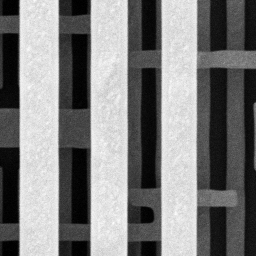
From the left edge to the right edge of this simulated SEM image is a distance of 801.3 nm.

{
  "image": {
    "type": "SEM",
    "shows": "wiring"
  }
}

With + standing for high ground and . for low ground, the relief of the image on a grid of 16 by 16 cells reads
.+++..++..++....
.+++..++..++....
.+++..++..++....
.+++..++..++....
.+++..++..++....
.+++..++..++....
.+++..++..++....
.+++..++..++....
.+++..++..++....
.+++..++..++....
.+++..++..++....
.+++..++..++....
.+++..++..++....
.+++..++..++....
.+++..++..++....
.+++..++..++....